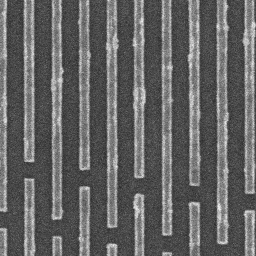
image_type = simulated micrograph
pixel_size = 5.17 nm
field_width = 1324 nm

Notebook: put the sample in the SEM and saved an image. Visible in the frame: parallel lines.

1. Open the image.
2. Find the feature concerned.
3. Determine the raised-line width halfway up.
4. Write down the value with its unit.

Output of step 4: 0.0497 um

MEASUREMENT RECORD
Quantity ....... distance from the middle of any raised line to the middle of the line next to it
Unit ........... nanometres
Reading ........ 142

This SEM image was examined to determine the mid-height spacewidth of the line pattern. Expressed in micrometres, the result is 0.0943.